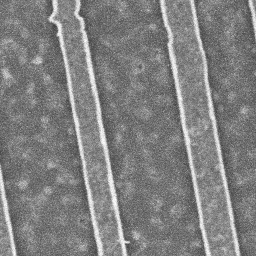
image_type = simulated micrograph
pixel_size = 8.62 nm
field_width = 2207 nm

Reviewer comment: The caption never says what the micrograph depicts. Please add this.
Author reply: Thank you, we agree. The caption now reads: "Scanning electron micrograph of one or a few lines or trenches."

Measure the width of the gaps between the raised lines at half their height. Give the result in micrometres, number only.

0.697